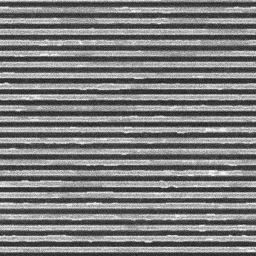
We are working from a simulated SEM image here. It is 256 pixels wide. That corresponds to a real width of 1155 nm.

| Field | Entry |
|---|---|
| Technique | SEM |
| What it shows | parallel lines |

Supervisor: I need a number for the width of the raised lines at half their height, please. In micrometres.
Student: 0.0254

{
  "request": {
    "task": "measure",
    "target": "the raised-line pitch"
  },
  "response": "10.9 pixels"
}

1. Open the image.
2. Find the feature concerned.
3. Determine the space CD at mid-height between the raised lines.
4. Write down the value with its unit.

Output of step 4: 20.9 nanometers